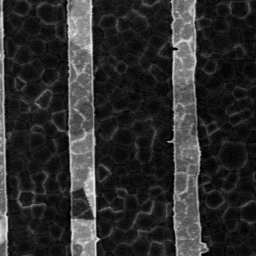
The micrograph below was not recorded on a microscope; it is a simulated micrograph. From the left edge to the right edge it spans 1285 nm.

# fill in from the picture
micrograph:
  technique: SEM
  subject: one or a few lines or trenches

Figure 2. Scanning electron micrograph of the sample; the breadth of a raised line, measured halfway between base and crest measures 115 nm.